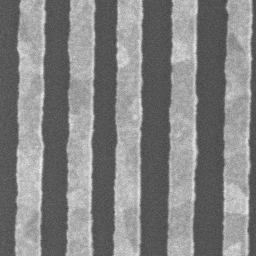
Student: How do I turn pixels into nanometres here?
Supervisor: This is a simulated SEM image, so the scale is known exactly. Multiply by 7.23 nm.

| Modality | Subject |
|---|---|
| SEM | lines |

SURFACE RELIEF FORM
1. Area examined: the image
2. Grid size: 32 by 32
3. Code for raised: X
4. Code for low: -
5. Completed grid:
---XXX---XXX---XXX----XXX---XXX-
---XXX---XXX---XXX----XXX----XX-
---XX----XXX---XXX----XX-----XX-
--XXX----XXX---XXX----XX-----XX-
--XXXX---XXX---XXX----XX----XXX-
--XXXX---XXX---XXX----XX----XXX-
--XXXX---XXX---XXX----XX----XXX-
---XX----XXX---XXX---XXX----XXX-
--XXX----XXX---XXX----XX----XXX-
---XX----XXX---XXX---XXX----XXX-
--XXX----XXX---XXX---XXX----XXX-
--XXX----XXX---XXX---XXX----XXX-
--XXX----XXX---XXX---XXX----XXX-
--XXX----XXX---XXX---XXX----XXX-
--XXX----XXX---XXX---XXX----XXX-
--XXX----XXX---XXX---XXX----XXX-
--XXX----XX----XX----XXX----XXX-
--XXX----XX----XX----XXX----XXX-
--XXX---XXX----XX----XXX----XXX-
--XXX----XX----XX----XXX----XXX-
--XXX----XX----XX----XXX----XXX-
--XXX----XX----XX----XXX----XXX-
--XXX----XX---XXX----XXX----XXX-
--XXX----XX---XXX----XXX----XXX-
--XXX---XXX---XXX----XXX----XXX-
--XXX----XX---XXX----XXX----XXX-
--XXX----XX---XXX----XXX----XXX-
--XXX----XX---XXX----XXX----XXX-
--XXX----XX---XXX----XXX----XXX-
--XXX---XXX---XXX----XXX----XXX-
--XXX---XXX---XXX----XXX----XXX-
--XXX---XXX---XXX----XXX----XXX-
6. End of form